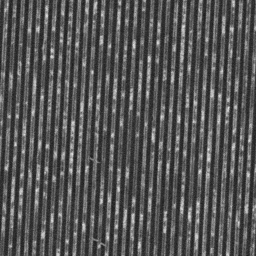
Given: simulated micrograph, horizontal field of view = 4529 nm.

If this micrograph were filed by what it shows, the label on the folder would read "parallel lines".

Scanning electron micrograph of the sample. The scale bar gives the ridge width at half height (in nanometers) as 50.8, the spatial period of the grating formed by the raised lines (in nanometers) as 143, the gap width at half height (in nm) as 88.3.